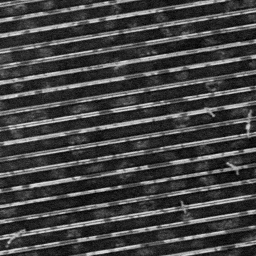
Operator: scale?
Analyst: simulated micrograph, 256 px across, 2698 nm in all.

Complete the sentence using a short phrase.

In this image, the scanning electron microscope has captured parallel lines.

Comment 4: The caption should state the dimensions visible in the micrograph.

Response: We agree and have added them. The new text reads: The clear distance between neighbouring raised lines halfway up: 0.125 micrometres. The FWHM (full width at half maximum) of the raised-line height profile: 37.7 nm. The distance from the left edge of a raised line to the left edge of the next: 161 nanometers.